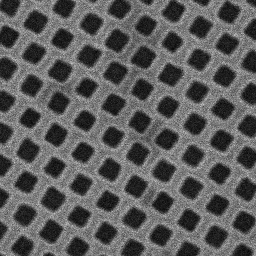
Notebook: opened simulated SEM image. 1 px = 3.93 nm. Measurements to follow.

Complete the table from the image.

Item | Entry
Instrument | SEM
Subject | a regular array of holes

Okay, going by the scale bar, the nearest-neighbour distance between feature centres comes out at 123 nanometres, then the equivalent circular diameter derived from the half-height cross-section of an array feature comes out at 83.3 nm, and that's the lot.